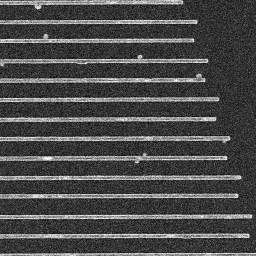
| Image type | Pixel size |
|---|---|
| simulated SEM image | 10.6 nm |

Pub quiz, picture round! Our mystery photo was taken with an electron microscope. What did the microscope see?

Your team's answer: parallel lines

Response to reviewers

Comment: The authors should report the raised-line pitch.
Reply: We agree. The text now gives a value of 206 nanometers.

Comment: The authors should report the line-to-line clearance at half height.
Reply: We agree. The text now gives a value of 167 nanometers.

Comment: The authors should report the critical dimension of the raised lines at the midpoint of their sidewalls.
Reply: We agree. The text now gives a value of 39.7 nanometers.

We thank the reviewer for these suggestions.